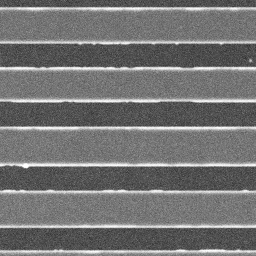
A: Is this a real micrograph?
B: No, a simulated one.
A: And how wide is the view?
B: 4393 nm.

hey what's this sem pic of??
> lines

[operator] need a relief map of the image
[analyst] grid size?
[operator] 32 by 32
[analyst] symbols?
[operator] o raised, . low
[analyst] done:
................................
oooooooooooooooooooooooooooooooo
oooooooooooooooooooooooooooooooo
oooooooooooooooooooooooooooooooo
oooooooooooooooooooooooooooooooo
................................
................................
................................
ooooo.ooooo.oooo.oooooo.oooooooo
oooooooooooooooooooooooooooooooo
oooooooooooooooooooooooooooooooo
oooooooooooooooooooooooooooooooo
oooooooooooooooooooooooooooooooo
................................
................................
................................
oooooooooooooooooooooooooooooooo
oooooooooooooooooooooooooooooooo
oooooooooooooooooooooooooooooooo
oooooooooooooooooooooooooooooooo
oooooooooooooooooooooooooooooooo
................................
................................
................................
oooooooooooooooooooooooooooooooo
oooooooooooooooooooooooooooooooo
oooooooooooooooooooooooooooooooo
oooooooooooooooooooooooooooooooo
................................
................................
................................
oooooooooooooooooooooooooooooooo